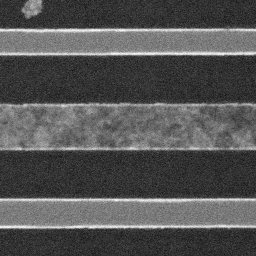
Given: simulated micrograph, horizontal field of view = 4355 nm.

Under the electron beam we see lines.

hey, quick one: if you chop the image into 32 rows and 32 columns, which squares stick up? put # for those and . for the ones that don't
................................
................................
................................
................................
################################
################################
################################
................................
................................
................................
................................
................................
................................
################################
################################
################################
################################
################################
################################
................................
................................
................................
................................
................................
................................
################################
################################
################################
................................
................................
................................
................................